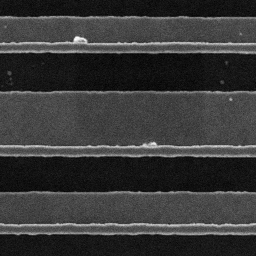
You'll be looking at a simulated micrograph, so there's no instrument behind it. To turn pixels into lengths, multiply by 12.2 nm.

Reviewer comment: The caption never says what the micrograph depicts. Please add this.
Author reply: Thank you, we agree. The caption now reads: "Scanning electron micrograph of lines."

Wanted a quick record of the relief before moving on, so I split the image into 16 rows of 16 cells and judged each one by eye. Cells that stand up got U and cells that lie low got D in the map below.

DDDDDDDDDDDDDDDD
UUUUUUUUUUUUUUUU
UUUUUUUUUUUUUUUU
DDDDDDDDDDDDDDDD
DDDDDDDDDDDDDDDD
DDDDDDDDDDDDDDDD
UUUUUUUUUUUUUUUU
UUUUUUUUUUUUUUUU
UUUUUUUUUUUUUUUU
UUUUUUUUUUUUUUUU
DDDDDDDDDDDDDDDD
DDDDDDDDDDDDDDDD
UUUUUUUUUUUUUUUU
UUUUUUUUUUUUUUUU
UUUUUUUUUUUUUUUU
DDDDDDDDDDDDDDDD